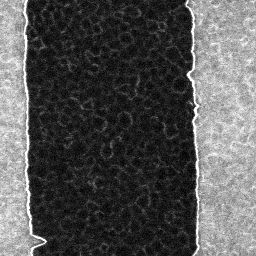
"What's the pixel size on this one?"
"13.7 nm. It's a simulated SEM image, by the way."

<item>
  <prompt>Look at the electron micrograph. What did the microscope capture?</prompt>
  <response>one or a few lines or trenches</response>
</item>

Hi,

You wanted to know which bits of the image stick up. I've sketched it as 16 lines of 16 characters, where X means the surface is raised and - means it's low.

--XXXXXXXXXX----
--XXXXXXXXXX----
--XXXXXXXXXX----
--XXXXXXXXXX----
--XXXXXXXXXX----
--XXXXXXXXXX----
--XXXXXXXXXX----
--XXXXXXXXXX----
--XXXXXXXXXX----
--XXXXXXXXXX----
--XXXXXXXXXX----
--XXXXXXXXXX----
--XXXXXXXXXX----
--XXXXXXXXXX----
--XXXXXXXXXX----
--XXXXXXXXXX----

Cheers